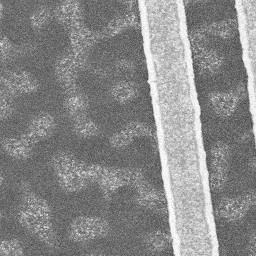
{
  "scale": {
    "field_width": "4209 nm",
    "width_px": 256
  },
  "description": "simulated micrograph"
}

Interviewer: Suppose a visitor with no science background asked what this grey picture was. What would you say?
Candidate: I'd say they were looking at one or a few lines or trenches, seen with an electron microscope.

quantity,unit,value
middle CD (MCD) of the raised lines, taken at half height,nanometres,614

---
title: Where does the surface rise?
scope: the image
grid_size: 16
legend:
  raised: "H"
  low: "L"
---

LLLLLLLLLHHLLLLH
LLLLLLLLLHHLLLLH
LLLLLLLLLHHHLLLH
LLLLLLLLLHHHLLLH
LLLLLLLLLHHHLLLL
LLLLLLLLLLHHLLLL
LLLLLLLLLLHHLLLL
LLLLLLLLLLHHLLLL
LLLLLLLLLLHHLLLL
LLLLLLLLLLHHHLLL
LLLLLLLLLLHHHLLL
LLLLLLLLLLHHHLLL
LLLLLLLLLLLHHLLL
LLLLLLLLLLLHHLLL
LLLLLLLLLLLHHLLL
LLLLLLLLLLLHHLLL